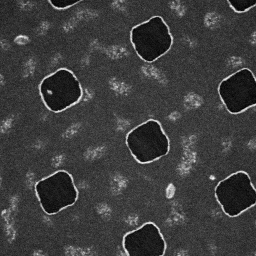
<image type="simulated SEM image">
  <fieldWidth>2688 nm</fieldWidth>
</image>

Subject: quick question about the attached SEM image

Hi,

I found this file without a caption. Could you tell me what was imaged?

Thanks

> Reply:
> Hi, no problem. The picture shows holes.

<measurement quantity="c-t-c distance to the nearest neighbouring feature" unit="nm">1070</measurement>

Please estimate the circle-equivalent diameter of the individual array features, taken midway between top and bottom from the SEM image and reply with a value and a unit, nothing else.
421 nm